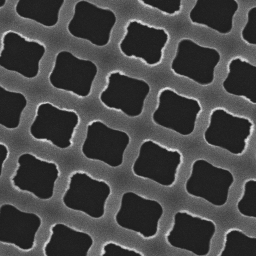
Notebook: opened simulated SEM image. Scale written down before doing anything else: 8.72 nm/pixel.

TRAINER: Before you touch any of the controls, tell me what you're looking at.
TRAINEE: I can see a regular array of holes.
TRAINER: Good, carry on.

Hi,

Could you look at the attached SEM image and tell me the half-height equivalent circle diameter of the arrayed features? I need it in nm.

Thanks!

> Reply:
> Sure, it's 368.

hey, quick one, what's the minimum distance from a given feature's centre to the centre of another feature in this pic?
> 472 nm